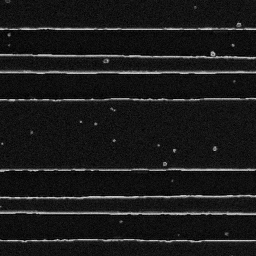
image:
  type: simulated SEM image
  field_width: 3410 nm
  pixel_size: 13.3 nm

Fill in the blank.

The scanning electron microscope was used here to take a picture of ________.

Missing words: lines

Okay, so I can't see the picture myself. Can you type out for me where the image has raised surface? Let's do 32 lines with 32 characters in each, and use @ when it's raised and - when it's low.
@@@@@@@@@@@@@@@@@@@@@@@@@@@@@@@@
@@@@@@@@@@@@@@@@@@@@@@@@@@@@@@@@
@@@@@@@@@@@@@@@@@@@@@@@@@@@@@@@@
@@@@@@@@@@@@@@@@@@@@@@@@@@@@@@@@
--------------------------------
--------------------------------
--------------------------------
@@@@@@@@@@@@@@@@@@@@@@@@@@@@@@@@
@@@@@@@@@@@@@@@@@@@@@@@@@@@@@@@@
--------------------------------
--------------------------------
--------------------------------
----@------@-@@@@@@@@--@@@@@@@@@
@@@@@@@@@@@@@@@@@@@@@@@@@@@@@@@@
@@@@@@@@@@@@@@@@@@@@@@@@@@@@@@@@
@@@@@@@@@@@@@@@@@@@@@@@@@@@@@@@@
@@@@@@@@@@@@@@@@@@@@@@@@@@@@@@@@
@@@@@@@@@@@@@@@@@@@@@@@@@@@@@@@@
@@@@@@@@@@@@@@@@@@@@@@@@@@@@@@@@
@@@@@@@@@@@@@@@@@@@@@@@@@@@@@@@@
@@@@@@@@@@@@@@@@@@@@@@@@@@@@@@@@
--------------------------------
--------------------------------
--------------------------------
--------------------------------
@@@@@@@@@@@@@@@@@@@@@@@@@@@@@@@@
@@@@@@@@@@@@@@@@@@@@@@@@@@@@@@@@
--------------------------------
--------------------------------
--------------------------------
@@@@@@@@@@@@@@@@@@@@@@@@@@@@@@@@
@@@@@@@@@@@@@@@@@@@@@@@@@@@@@@@@